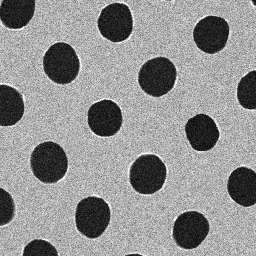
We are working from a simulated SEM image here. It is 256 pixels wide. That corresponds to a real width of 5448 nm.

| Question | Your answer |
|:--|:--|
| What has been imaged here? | a regular array of holes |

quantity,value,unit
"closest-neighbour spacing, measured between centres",1450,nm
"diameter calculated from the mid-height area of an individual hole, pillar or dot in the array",807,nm